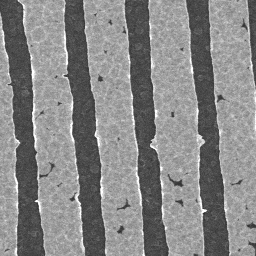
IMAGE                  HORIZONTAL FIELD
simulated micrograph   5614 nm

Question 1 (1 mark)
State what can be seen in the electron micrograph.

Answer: one or a few lines or trenches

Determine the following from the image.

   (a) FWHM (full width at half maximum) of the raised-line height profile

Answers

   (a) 753 nanometres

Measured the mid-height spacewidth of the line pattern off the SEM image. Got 0.473 µm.